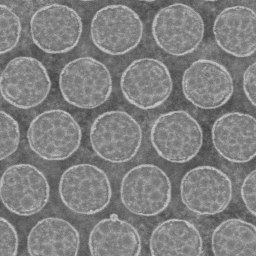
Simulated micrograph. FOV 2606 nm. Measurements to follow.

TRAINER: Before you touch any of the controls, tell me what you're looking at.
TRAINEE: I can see a regular array of raised bodies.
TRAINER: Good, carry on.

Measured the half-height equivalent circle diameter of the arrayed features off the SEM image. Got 511 nanometres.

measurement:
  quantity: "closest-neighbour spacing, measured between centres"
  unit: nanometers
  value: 616